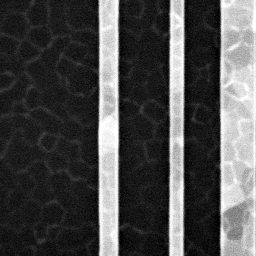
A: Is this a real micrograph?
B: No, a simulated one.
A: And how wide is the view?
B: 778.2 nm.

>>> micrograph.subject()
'one or a few lines or trenches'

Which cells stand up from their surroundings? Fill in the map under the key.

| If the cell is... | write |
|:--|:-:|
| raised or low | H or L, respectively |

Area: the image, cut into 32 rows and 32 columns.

LLLLLLLLLLLLLHHLLLLLLHHLLLLLHHHH
LLLLLLLLLLLLLHHLLLLLLHHLLLLLHHHH
LLLLLLLLLLLLLHHLLLLLLHHLLLLLHHHH
LLLLLLLLLLLLLHHLLLLLLHHLLLLLHHHH
LLLLLLLLLLLLLHHLLLLLLHHLLLLLHHHH
LLLLLLLLLLLLLHHLLLLLLHHLLLLLHHHH
LLLLLLLLLLLLLHHLLLLLLHHLLLLLHHHH
LLLLLLLLLLLLLHHLLLLLLHHLLLLLHHHH
LLLLLLLLLLLLLHHLLLLLLHHLLLLLHHHH
LLLLLLLLLLLLLHHLLLLLLHHLLLLLHHHH
LLLLLLLLLLLLLHHLLLLLLHHLLLLLHHHH
LLLLLLLLLLLLLHHLLLLLLHHLLLLLHHHH
LLLLLLLLLLLLLHHLLLLLLHHLLLLLHHHH
LLLLLLLLLLLLLHHLLLLLLHHLLLLLHHHH
LLLLLLLLLLLLLHHLLLLLLHHLLLLLHHHH
LLLLLLLLLLLLLHHLLLLLLHHLLLLLHHHH
LLLLLLLLLLLLHHHLLLLLLHHLLLLLHHHH
LLLLLLLLLLLLHHHLLLLLLHHLLLLLHHHH
LLLLLLLLLLLLHHHLLLLLLHHLLLLLHHHH
LLLLLLLLLLLLHHHLLLLLLHHLLLLLHHHH
LLLLLLLLLLLLLHHLLLLLLHHLLLLLHHHH
LLLLLLLLLLLLLHHLLLLLLHHLLLLLHHHH
LLLLLLLLLLLLLHHLLLLLLHHLLLLLHHHH
LLLLLLLLLLLLLHHLLLLLLHHLLLLLHHHH
LLLLLLLLLLLLLHHLLLLLLHHLLLLLHHHH
LLLLLLLLLLLLLHHLLLLLLHHLLLLLHHHH
LLLLLLLLLLLLLHHLLLLLLHHLLLLLHHHH
LLLLLLLLLLLLLHHLLLLLLHHLLLLLHHHH
LLLLLLLLLLLLLHHLLLLLLHHLLLLLHHHH
LLLLLLLLLLLLLHHLLLLLLHHLLLLLHHHH
LLLLLLLLLLLLLHHLLLLLLHHLLLLLHHHH
LLLLLLLLLLLLLHHLLLLLLHHLLLLLHHHH